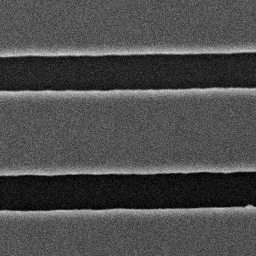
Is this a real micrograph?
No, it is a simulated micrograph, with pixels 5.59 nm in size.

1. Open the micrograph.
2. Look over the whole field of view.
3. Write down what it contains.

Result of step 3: lines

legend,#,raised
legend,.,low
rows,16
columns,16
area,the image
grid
################
################
################
................
................
................
################
################
################
################
################
................
................
################
################
################